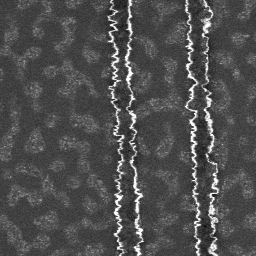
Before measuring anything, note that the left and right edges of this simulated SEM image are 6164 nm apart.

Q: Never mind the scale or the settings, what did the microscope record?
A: one or a few lines or trenches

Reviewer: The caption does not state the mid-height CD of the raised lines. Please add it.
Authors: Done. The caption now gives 430 nm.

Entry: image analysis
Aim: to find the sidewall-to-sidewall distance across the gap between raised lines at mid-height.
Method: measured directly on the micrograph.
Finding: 59.4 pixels